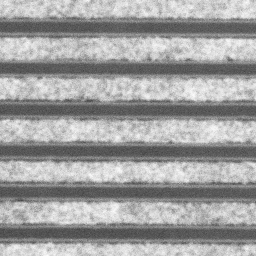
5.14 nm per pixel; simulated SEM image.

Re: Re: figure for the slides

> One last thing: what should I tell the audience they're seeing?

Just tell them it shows parallel lines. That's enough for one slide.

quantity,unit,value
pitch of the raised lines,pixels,41.2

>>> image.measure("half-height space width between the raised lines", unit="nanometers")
141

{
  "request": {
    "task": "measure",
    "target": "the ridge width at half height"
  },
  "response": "72.7 nanometers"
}